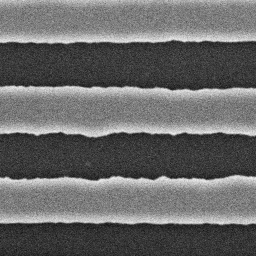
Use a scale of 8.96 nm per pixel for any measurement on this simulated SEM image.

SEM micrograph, lines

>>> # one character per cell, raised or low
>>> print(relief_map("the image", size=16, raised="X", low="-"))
XXXXXXXXXXXXXXXX
XXXXXXXXXXXXXXXX
XXXXXXXXXXXXXXXX
----------------
----------------
XXXXXXXXX-------
XXXXXXXXXXXXXXXX
XXXXXXXXXXXXXXXX
----------------
----------------
----------------
XXXXXXXXXXXXXXXX
XXXXXXXXXXXXXXXX
XXXXXXXXXXXXXXXX
----------------
----------------